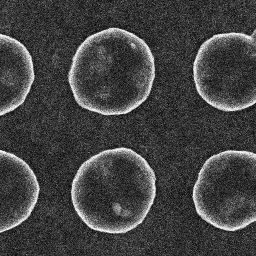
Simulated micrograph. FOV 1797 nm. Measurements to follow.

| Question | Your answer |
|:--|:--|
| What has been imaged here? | raised bodies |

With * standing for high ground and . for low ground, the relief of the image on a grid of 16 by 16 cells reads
................
................
*.....***....***
**...****...****
**..******..****
**...****...****
*....****....***
................
................
......**......*.
**...****....***
**...*****..****
**...*****..****
**...****....***
................
................